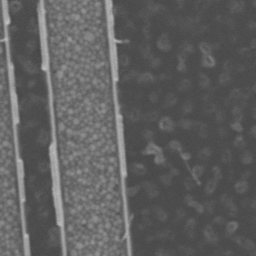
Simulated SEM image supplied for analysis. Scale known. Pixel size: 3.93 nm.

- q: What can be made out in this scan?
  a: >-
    one or a few lines or trenches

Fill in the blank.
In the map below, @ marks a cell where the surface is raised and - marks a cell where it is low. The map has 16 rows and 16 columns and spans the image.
@@@----@@@@@@@@@
@@@----@@@@@@@@@
@@@----@@@@@@@@@
@@@----@@@@@@@@@
-@@----@@@@@@@@@
-@@----@@@@@@@@@
-@@----@@@@@@@@@
-@@----@@@@@@@@@
-@@----@@@@@@@@@
-@@----@@@@@@@@@
-@@@----@@@@@@@@
-@@@----@@@@@@@@
-@@@----@@@@@@@@
-@@@----@@@@@@@@
-@@@----@@@@@@@@
--@@----@@@@@@@@